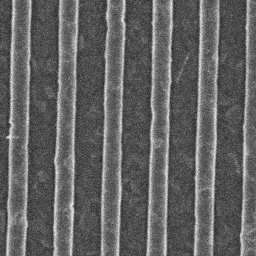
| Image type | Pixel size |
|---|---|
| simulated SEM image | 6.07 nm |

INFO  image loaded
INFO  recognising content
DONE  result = parallel lines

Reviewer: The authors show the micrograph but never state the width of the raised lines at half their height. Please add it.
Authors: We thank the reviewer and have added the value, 106 nanometres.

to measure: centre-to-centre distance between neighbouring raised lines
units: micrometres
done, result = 0.285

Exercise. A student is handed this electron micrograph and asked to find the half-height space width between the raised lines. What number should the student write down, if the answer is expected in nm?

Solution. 178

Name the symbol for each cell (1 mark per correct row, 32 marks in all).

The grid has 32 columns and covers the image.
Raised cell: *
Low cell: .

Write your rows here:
..**...***....**...**....**....*
..**...***...***...**....**....*
..**...***...**....**....**....*
..**...***...***...**....**....*
..**...***...***...**....**....*
..**...***...**....**....**....*
.***...***...**....**....**....*
.***...**....**....**....**....*
.***...**....**....**....**....*
.***...**....**....**....**....*
.***...**....**....**....**....*
.***...**....**....**....**....*
.***...**....**....**....**....*
.***...**....**....**....**....*
.***...**....**....**....**....*
.**....**....**....**....**...**
.**....**....**....**....**...**
.**....**....**....**....**....*
.**....**....**....**....**....*
.**....**....**....**....**....*
.**....**....**....**....**...**
.**....**....**....**....**...**
.**....**....**....**...***...**
.**....**....**....**....**...**
.**....**....**....**....**...**
.**....**....**....**....**...**
.**....**....**....**...***...**
.**....**....**....**...***...**
.**....**....**....**...***...**
.**....**....**....**....**...**
.**....**....**....**...**....**
.**....**....**....**...***...**